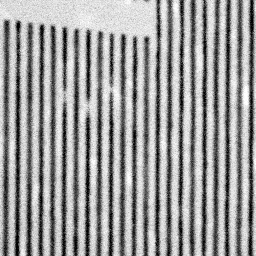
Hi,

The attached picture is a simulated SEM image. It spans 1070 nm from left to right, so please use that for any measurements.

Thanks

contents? parallel lines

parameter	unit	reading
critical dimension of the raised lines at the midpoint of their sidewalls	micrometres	0.0319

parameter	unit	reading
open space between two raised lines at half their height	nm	17.3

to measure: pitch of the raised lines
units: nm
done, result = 48.9